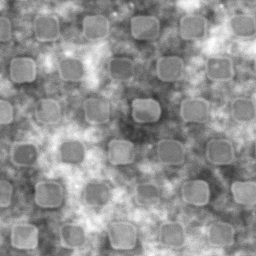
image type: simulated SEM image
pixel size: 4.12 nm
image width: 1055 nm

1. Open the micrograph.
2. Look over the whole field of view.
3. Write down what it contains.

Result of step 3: a regular array of raised bodies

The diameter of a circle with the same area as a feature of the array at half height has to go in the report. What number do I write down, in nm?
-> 110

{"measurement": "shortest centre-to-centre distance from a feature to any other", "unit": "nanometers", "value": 196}